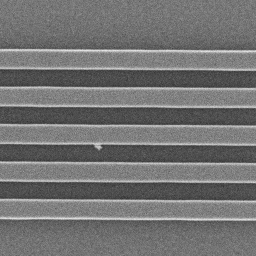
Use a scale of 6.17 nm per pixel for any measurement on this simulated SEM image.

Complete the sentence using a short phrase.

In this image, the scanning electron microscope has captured groups of lines, slits or small figures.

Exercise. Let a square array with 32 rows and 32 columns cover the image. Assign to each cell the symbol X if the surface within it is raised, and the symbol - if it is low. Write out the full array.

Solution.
--------------------------------
--------------------------------
--------------------------------
--------------------------------
--------------------------------
--------------------------------
XXXXXXXXXXXXXXXXXXXXXXXXXXXXXXXX
XXXXXXXXXXXXXXXXXXXXXXXXXXXXXXXX
XXXXXXXXXXXXXXXXXXXXXXXXXXXXXXXX
--------------------------------
--------------------------------
XXXXXXXXXXXXXXXXXXXXXXXXXXXXXXXX
XXXXXXXXXXXXXXXXXXXXXXXXXXXXXXXX
--------------------------------
--------------------------------
--------------------------------
XXXXXXXXXXXXXXXXXXXXXXXXXXXXXXXX
XXXXXXXXXXXXXXXXXXXXXXXXXXXXXXXX
--------------------------------
--------------------------------
XXXXXXXXXXXXXXXXXXXXXXXXXXXXXXXX
XXXXXXXXXXXXXXXXXXXXXXXXXXXXXXXX
XXXXXXXXXXXXXXXXXXXXXXXXXXXXXXXX
--------------------------------
--------------------------------
XXXXXXXXXXXXXXXXXXXXXXXXXXXXXXXX
XXXXXXXXXXXXXXXXXXXXXXXXXXXXXXXX
-----------------------XXXXXXXXX
--------------------------------
--------------------------------
--------------------------------
--------------------------------